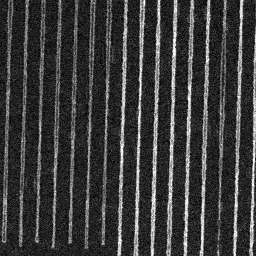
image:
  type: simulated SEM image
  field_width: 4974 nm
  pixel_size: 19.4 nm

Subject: parallel lines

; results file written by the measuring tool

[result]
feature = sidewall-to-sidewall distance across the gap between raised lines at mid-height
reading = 274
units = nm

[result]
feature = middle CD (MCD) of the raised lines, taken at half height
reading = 43.7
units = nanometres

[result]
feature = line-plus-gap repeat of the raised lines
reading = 320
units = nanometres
